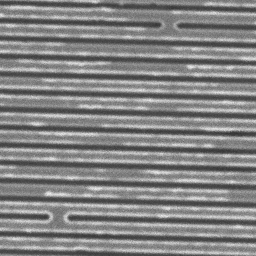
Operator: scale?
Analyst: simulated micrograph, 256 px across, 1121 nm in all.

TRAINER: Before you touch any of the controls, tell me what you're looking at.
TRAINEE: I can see parallel lines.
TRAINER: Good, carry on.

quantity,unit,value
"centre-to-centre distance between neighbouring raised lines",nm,77.8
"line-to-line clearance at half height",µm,0.029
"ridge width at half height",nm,51.5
